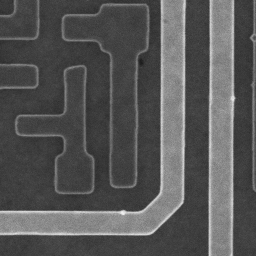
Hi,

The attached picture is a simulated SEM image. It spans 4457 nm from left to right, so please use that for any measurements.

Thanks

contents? wiring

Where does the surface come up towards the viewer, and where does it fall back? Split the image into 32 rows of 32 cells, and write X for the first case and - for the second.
--XXX--------XX-----XXX---XXX---
--XXX-------XXXXXXX-XXX---XXX---
XXXXX---XXXXXXXXXXX-XXX---XXX---
XXXXX---XXXXXXXXXXX-XXX---XXX---
XXXXX---XXXXXXXXXXX-XXX---XXX--X
------------XXXXXX--XXX---XXX---
-------------XXXXX--XXX---XXX---
--------------XXX---XXX---XXX---
XXXXX----XX---XXX---XXX---XXX---
XXXXX---XXX---XXX---XXX---XXX---
XXXXX---XXX---XXX---XXX---XXX---
--------XXX---XXX---XXX---XXX---
--------XXX---XXX---XXX---XXX---
--------XXX---XXX---XXX---XXX---
--XXXXXXXXX---XXX---XXX---XXX---
--XXXXXXXXX---XXX---XXX---XXX---
--XXXXXXXXX---XXX---XXX---XXX---
--------XXX---XXX---XXX---XXX---
--------XXX---XXX---XXX---XXX---
-------XXXX---XXX---XXX---XXX---
-------XXXXX--XXX---XXX---XXX---
-------XXXXX--XXX---XXX---XXX---
-------XXXXX--XXX---XXX---XXX---
-------XXXXX--------XXX---XXX---
--------------------XXX---XXX---
-------------------XXXX---XXX---
XXXXXXXXXXXXXXXX-XXXXX----XXX---
XXXXXXXXXXXXXXXXXXXXX-----XXX---
XXXXXXXXXXXXXXXXXXXX------XXX---
--------------------------XXX---
--------------------------XXX---
--------------------------XXX---